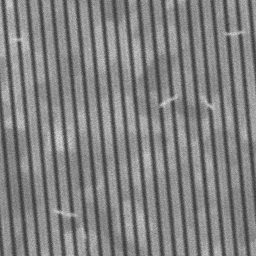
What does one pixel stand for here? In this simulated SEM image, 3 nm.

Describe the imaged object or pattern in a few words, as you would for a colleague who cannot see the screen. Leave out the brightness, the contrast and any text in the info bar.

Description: parallel lines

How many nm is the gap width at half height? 16.1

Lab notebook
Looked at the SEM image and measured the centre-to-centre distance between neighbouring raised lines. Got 0.0368 µm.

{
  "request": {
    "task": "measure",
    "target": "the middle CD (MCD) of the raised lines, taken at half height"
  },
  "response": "7.23 px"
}